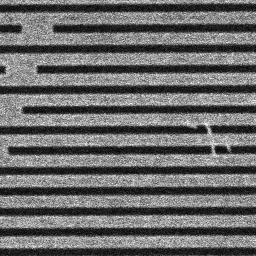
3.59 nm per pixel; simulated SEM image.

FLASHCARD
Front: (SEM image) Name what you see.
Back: parallel lines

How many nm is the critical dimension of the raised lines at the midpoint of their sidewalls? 44.8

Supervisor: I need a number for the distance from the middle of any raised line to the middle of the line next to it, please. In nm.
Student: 72.9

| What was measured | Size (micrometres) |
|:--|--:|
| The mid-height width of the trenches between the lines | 0.0278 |